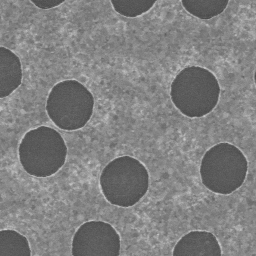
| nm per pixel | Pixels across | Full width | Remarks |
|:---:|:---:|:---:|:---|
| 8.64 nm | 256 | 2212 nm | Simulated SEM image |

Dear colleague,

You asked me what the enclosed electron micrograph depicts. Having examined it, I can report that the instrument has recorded holes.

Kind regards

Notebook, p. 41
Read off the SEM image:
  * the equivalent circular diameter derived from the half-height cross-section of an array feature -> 431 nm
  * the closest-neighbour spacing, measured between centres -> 708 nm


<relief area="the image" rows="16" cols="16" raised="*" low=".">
*******..***..**
****************
****************
.***************
.**********..***
.**..******...**
***...*****...**
***...**********
**..************
*...*********..*
*...***..****..*
******...****..*
*******..*******
****************
.****..*****.***
..***..****...**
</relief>